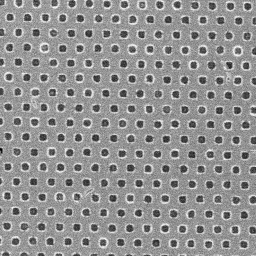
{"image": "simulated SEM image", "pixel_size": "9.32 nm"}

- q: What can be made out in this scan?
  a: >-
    a regular array of holes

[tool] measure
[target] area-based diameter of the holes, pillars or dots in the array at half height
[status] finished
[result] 76.6 nm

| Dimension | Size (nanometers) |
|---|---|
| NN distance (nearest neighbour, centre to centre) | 157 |